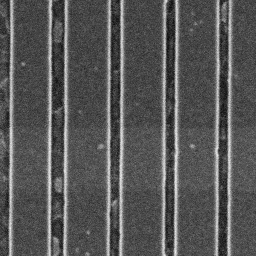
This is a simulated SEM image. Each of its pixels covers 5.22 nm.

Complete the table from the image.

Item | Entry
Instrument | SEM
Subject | parallel lines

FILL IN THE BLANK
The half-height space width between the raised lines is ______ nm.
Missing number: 56.1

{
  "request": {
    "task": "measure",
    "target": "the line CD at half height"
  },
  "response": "229 nm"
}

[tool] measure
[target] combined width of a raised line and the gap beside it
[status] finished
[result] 290 nanometers